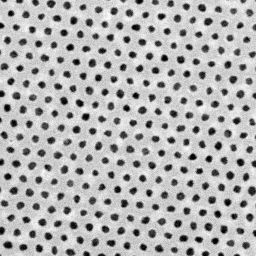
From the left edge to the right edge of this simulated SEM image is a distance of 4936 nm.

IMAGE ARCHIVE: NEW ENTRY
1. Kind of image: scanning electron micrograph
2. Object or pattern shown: a regular array of holes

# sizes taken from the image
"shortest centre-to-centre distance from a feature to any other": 294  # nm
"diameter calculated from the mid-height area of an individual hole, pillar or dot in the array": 161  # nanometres